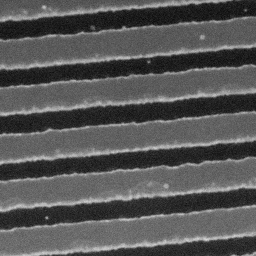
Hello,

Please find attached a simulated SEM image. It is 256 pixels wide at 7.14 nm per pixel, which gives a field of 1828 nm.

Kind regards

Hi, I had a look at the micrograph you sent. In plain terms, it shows lines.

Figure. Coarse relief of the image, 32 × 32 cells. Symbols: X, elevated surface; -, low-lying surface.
XXXXXXXXXXXXXXXXXXXXXX----------
XXXXXXXXXXX---------------------
-----------------------------XXX
----------------XXXXXXXXXXXXXXXX
------XXXXXXXXXXXXXXXXXXXXXXXXXX
XXXXXXXXXXXXXXXXXXXXXXXXXXXXXXXX
XXXXXXXXXXXXXXXXXXXXXXXX--------
XXXXXXXXXXXX--------------------
----------------------------XXXX
----------------XXXXXXXXXXXXXXXX
------XXXXXXXXXXXXXXXXXXXXXXXXXX
XXXXXXXXXXXXXXXXXXXXXXXXXXXXX---
XXXXXXXXXXXXXXXXXXXXXX----------
XXXXXXXXX-----------------------
--------------------------XXXXXX
---------------XXXXXXXXXXXXXXXXX
-----XXXXXXXXXXXXXXXXXXXXXXXXXXX
XXXXXXXXXXXXXXXXXXXXXXXXXXXXXXX-
XXXXXXXXXXXXXXXXXXXX------------
XXXXXXXX------------------------
-----------------------X-XXXXXXX
-------------XXXXXXXXXXXXXXXXXXX
--XXXXXXXXXXXXXXXXXXXXXXXXXXXXXX
XXXXXXXXXXXXXXXXXXXXXXXXXXXXX---
XXXXXXXXXXXXXXXXX---------------
XXXXXXX-------------------------
-------------------------XXXXXXX
--------------XXXXXXXXXXXXXXXXXX
---XXXXXXXXXXXXXXXXXXXXXXXXXXXXX
XXXXXXXXXXXXXXXXXXXXXXXXXXXXXX--
XXXXXXXXXXXXXXXXXXXX------------
XXXXXXXXX-----------------------